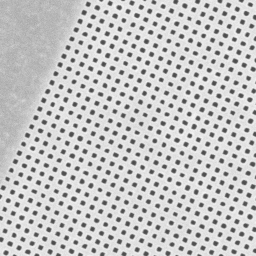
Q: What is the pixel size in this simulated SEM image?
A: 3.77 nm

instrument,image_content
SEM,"a regular array of holes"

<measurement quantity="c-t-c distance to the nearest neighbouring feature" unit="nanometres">35.4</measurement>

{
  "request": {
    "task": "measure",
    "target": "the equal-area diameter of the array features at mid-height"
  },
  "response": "21.3 nm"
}